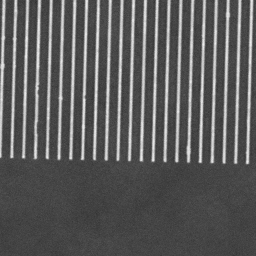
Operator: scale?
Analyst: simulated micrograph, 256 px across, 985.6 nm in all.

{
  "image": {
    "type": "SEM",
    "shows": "parallel lines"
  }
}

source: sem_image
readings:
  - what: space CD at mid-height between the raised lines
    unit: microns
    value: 0.0371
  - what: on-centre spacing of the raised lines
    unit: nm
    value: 45.4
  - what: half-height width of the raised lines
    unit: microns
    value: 0.0077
